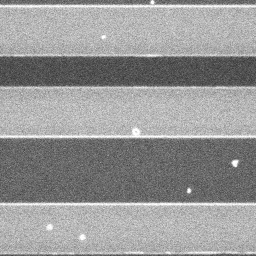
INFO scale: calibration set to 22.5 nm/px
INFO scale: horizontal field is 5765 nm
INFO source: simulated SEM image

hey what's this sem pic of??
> lines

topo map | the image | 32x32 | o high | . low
oooooooooooooooooooooooooooooooo
................................
................................
................................
................................
................................
................................
oooooooooooooooooooooooooooooooo
oooooooooooooooooooooooooooooooo
oooooooooooooooooooooooooooooooo
oooooooooooooooooooooooooooooooo
................................
................................
................................
................................
................................
................................
oooooooooooooooooooooooooooooooo
oooooooooooooooooooooooooooooooo
oooooooooooooooooooooooooooooooo
oooooooooooooooooooooooooooooooo
oooooooooooooooooooooooooooooooo
oooooooooooooooooooooooooooooooo
oooooooooooooooooooooooooooooooo
oooooooooooooooooooooooooooooooo
................................
................................
................................
................................
................................
................................
................................